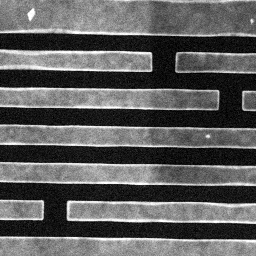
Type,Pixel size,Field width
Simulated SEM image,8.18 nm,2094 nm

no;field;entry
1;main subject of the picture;groups of lines, slits or small figures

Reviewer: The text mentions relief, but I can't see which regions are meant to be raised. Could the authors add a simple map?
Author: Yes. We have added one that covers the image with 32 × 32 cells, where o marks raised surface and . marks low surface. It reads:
oooooooooooooooooooooooooooooooo
oooooooooooooooooooooooooooooooo
oooooooooooooooooooooooooooooooo
oooooooooooooooooooooooooooooooo
.......................oooo....o
................................
oo...........ooo................
ooooooooooooooooooo...oooooooooo
.....oooooooooooooo...oooooooooo
................................
................................
ooooooooooooooooooooooooooo....o
ooooooooooooooooooooooooooo...oo
................ooooooooooo...oo
................................
................................
oooooooooooooooooooooooooooooooo
oooooooooooooooooooooooooooooooo
................................
................................
ooooooooo.......................
oooooooooooooooooooooooooooooooo
oooooooooooooooooooooooooooooooo
................................
................................
ooooo....oooooooooooooooooo.....
ooooo....ooooooooooooooooooooooo
...........o..oooooooooooooooooo
................................
................................
oooooooooooooooooooooooooooooooo
oooooooooooooooooooooooooooooooo